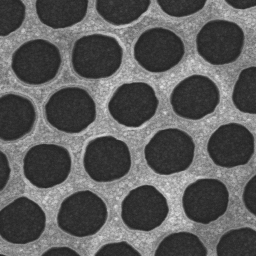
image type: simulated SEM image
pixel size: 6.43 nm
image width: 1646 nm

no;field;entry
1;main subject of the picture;a regular array of holes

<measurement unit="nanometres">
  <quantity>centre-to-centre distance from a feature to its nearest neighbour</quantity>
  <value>386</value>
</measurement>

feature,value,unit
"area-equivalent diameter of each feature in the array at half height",298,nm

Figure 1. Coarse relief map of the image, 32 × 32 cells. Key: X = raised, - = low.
---X-------X-------X------XXX---
---XX------X------XXX----XXXXXXX
---XX-----XXX----XXXXXXXXXXXXXXX
--XXXXX-XXXXXXXXXXXXXXXXX-----XX
XXXXXXXXXXX--XXXXX----XXX-----XX
XXX----XX------XX------XX-----XX
XX-----XX------XX------XX-----XX
XX------X------XX------XXX---XXX
XX-----XX------XXX---XXXXXXXXXX-
XX-----XXX----XXXXXXXXXX-XXXXX--
XXXX-XXXXXXXXXXX--XXXX-----XX---
XXXXXXX----XXX-----XXX-----XX---
---XXX------XX------X------XX---
----XX------XX------XX-----XXX--
----XX------XX-----XXXX---XXXXXX
----XX-----XXXX---XXXXXXXXXX--XX
----XXXX--XXXXXXXXXX---XXXX----X
X-XXXXXXXXXX---XXXX-----XX------
XXXX----XXX-----XX------XX------
-XX------XX-----XX------XX-----X
-XX------XX-----XX------XXX---XX
-XX------XX-----XXX---XXXXXXXXXX
-XXX----XXXX--XXXXXXXXXXX--XXXX-
XXXXX-XXXXXXXXXXX--XXXX-----XXX-
XXXXXXXXX---XXXX----XXX------X--
X----XXX-----XX------XX-----XXX-
-----XX------XX------XX-----XXX-
------X------XX------XXX---XXXXX
------XX-----XXX---XXXXXXXXXXX-X
-----XXXX--XXXXXXXXXX---XXXX----
XXXXXXXXXXXXXX--XXXX-----XX-----
XXXXXX---XXX-----XX-------X-----